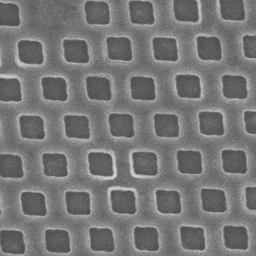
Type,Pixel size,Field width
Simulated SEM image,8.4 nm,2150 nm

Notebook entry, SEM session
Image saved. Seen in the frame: a regular array of holes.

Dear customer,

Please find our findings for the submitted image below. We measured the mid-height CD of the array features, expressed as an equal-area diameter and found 225 nm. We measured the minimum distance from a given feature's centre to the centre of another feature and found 43.2 pixels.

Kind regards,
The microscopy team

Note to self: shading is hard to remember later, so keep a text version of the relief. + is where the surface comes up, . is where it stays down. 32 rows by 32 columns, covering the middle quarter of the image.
++++++++++++++++++++++++++++++++
++++++++++++++++++++++++++++++++
+++++++++++++++++++++++++++++++.
++++++.....++++++.....++++++....
.++++.......++++.......+++++....
.++++.......++++.......+++++....
.++++.......+++++......+++++....
.+++++......+++++......+++++....
.+++++......+++++......++++++...
++++++++++++++++++++++++++++++++
++++++++++++++++++++++++++++++++
++++++++++++++++++++++++++++++++
+++++++++++.....+++++++.....++++
......+++++......+++++......++++
......+++++.......++++.......+++
......+++++.......++++.......+++
.......++++.......+++++......+++
.......+++++......+++++......+++
+.....++++++++++.+++++++++..++++
++++++++++++++++++++++++++++++++
++++++++++++++++++++++++++++++++
+++++++++++++++++++++++++++++...
++++++.....++++++......+++++....
.+++++......+..++......+++++....
.+++++..........+......+++++....
.+++++......+...........++++....
.+++++......+...........+++++...
.++++++.....+....+.....+++++++..
+++++++++++++.....++++++++++++++
++++++++++........++++++++++++++
++++++++++........++++++++++++++
++++++++++++..+.++++++++....++++